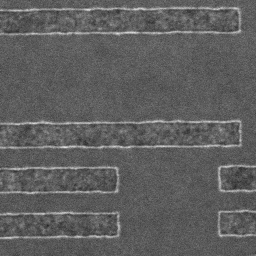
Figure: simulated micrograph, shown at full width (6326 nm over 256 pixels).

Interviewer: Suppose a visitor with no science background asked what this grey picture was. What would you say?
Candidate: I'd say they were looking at wiring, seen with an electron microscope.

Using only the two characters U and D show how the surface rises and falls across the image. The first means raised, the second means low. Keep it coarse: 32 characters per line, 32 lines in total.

DDDDDDDDDDDDDDDDDDDDDDDDDDDDDDDD
UUUUUUUUUUUUUUUUUUUUUUUUUUUUUUDD
UUUUUUUUUUUUUUUUUUUUUUUUUUUUUUDD
UUUUUUUUUUUUUUUUUUUUUUUUUUUUUUDD
DDDDDDDDDDDDDDDDDDDDDDDDDDDDDDDD
DDDDDDDDDDDDDDDDDDDDDDDDDDDDDDDD
DDDDDDDDDDDDDDDDDDDDDDDDDDDDDDDD
DDDDDDDDDDDDDDDDDDDDDDDDDDDDDDDD
DDDDDDDDDDDDDDDDDDDDDDDDDDDDDDDD
DDDDDDDDDDDDDDDDDDDDDDDDDDDDDDDD
DDDDDDDDDDDDDDDDDDDDDDDDDDDDDDDD
DDDDDDDDDDDDDDDDDDDDDDDDDDDDDDDD
DDDDDDDDDDDDDDDDDDDDDDDDDDDDDDDD
DDDDDDDDDDDDDDDDDDDDDDDDDDDDDDDD
DDDDDDDDDDDDDDDDDDDDDDDDDDDDDDDD
DDDUUUUDUUUUUUUUUUUUUUUUUUUUUUDD
UUUUUUUUUUUUUUUUUUUUUUUUUUUUUUDD
UUUUUUUUUUUUUUUUUUUUUUUUUUUUUUDD
DDDDDDDDDDDDDDDDDDDDDDDDDDDDDDDD
DDDDDDDDDDDDDDDDDDDDDDDDDDDDDDDD
DDDDDDDDDDDDDDDDDDDDDDDDDDDDDDDD
UUUUUUUUUUUUUUUDDDDDDDDDDDDUUUUU
UUUUUUUUUUUUUUUDDDDDDDDDDDDUUUUU
UUUUUUUUUUUUUUUDDDDDDDDDDDDDUUUU
DDDDDDDDDDDDDDDDDDDDDDDDDDDDDDDD
DDDDDDDDDDDDDDDDDDDDDDDDDDDDDDDD
DDDDDDDDDDDDDDDDDDDDDDDDDDDDUUUU
UUUUUUUUUUUUUUUDDDDDDDDDDDDUUUUU
UUUUUUUUUUUUUUUDDDDDDDDDDDDUUUUU
UUUUUUUUUUUUUUDDDDDDDDDDDDDDDDDD
DDDDDDDDDDDDDDDDDDDDDDDDDDDDDDDD
DDDDDDDDDDDDDDDDDDDDDDDDDDDDDDDD